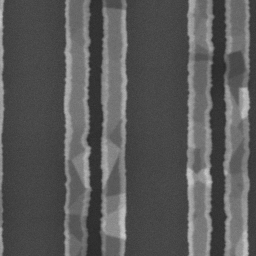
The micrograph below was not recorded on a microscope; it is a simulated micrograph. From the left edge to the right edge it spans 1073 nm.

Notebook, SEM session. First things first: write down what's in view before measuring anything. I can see lines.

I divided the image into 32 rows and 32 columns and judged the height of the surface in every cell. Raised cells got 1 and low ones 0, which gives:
00000000111001110000000011001110
00000000111001110000000011001110
00000000111001110000000011001110
00000000111001110000000011001110
00000000111001110000000011001110
00000000111001110000000011001110
00000000111001110000000011101110
00000000111001110000000011001110
00000000011001110000000011001110
00000000111001110000000011001110
00000000111001110000000011001110
00000000111001110000000011001110
00000000111001110000000011001110
00000000111001110000000011001110
00000000111001110000000011001110
00000000111001110000000011001110
00000000111001110000000011001110
00000000111001110000000011001110
00000000111001100000000011001110
00000000111001100000000011001110
00000000111001100000000011001110
00000000111001100000000011001110
00000000111001110000000011001110
00000000111001100000000011001110
00000000111001100000000011001110
00000000111001100000000011001110
00000000111001100000000011001110
00000000111001100000000011001110
00000000111001100000000011001110
00000000111001110000000011001110
00000000111001100000000011001110
00000000111001100000000011001110